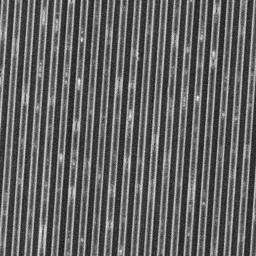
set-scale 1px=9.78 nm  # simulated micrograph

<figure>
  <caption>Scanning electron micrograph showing parallel lines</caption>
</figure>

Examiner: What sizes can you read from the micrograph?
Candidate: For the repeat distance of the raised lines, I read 129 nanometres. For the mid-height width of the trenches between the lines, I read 0.0683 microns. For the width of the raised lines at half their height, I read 68.3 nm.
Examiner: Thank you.